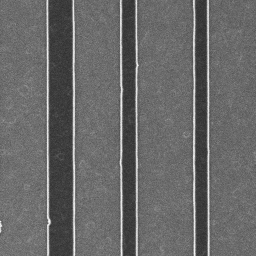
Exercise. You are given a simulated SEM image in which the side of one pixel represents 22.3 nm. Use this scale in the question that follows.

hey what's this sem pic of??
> one or a few lines or trenches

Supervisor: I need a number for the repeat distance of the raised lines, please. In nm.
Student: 1570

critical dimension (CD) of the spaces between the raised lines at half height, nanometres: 1070